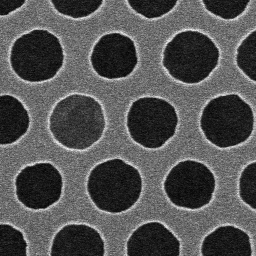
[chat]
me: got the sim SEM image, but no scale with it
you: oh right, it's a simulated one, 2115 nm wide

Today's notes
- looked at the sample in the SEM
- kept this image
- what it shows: a regular array of holes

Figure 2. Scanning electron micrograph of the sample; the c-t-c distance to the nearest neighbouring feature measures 607 nm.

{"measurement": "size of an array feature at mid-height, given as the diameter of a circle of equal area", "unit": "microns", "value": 0.44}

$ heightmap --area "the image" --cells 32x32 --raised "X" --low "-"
---XXXX------XXX------XXXX-----X
-XXXXXX-----XXXXX----XXXXX----XX
XXXXXXXXXXXXXXXXXXXXXXXXXXXXXXXX
XXXXXXXXXXXXXXXXXXXXXXXXXXXXXXXX
XXX----XXXXXX---XXXXXX----XXXXX-
XX------XXXX-----XXXX------XXX--
X-------XXXX-----XXXX------XXX--
X-------XXX------XXX-------XXX--
X------XXXXX-----XXXX------XXX--
XX-----XXXXX----XXXXX-----XXXXX-
XXXXXXXXXXXXXXXXXXXXXXXXXXXXXXXX
XXXXXXXXXXXXXXXXXXXXXXXXXXXXXXXX
--XXXXXX----XXXXX---XXXXXX----XX
---XXXX------XXX------XXXX-----X
----XX-------XXX------XXX-------
----XX-------XXX------XXX-------
---XXX-------XXX------XXX------X
--XXXXX-----XXXXX----XXXXX-----X
XXXXXXXXX--XXXXXXXXXXXXXXXXXXXXX
XXXXXXXXXXXXXXXXXXXXXXXXXXXXXXXX
XXXXX-XXXXXX----XXXXXX---XXXXXX-
XXX----XXXX------XXXX-----XXXX--
XX------XXX-------XXX------XXX--
XX------XXX-------XX-------XXX--
XX------XXX------XXXX-----XXXX--
XXX---XXXXXX-----XXXXX----XXXXX-
XXXXXXXXXXXXXX-XXXXXXXXXXXXXXXXX
XXXXXXXXXXXXXXXXXXXXXXXXXXXXXXXX
--XXXXXX----XXXXX----XXXXXX---XX
---XXXX------XXX------XXXX-----X
---XXX-------XXX------XXX------X
---XXX-------XXX------XXX------X